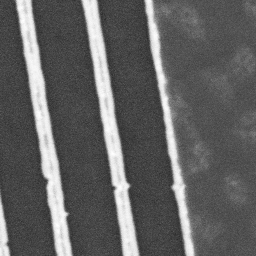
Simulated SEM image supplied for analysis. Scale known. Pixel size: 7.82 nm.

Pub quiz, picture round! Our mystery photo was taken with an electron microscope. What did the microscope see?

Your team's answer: one or a few lines or trenches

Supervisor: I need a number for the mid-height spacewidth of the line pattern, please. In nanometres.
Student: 409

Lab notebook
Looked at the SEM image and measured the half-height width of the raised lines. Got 0.0782 micrometres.